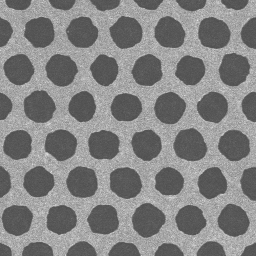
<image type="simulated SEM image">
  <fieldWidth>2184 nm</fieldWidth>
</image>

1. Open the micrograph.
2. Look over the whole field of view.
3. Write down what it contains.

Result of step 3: a regular array of holes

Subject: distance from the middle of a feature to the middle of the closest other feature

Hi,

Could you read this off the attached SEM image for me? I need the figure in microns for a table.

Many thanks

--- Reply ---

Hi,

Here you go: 0.364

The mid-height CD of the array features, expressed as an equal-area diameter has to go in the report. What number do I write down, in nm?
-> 262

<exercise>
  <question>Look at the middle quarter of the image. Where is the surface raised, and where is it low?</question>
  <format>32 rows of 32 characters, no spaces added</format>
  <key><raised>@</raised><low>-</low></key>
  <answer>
---@@@@-------@@@-------@@@@----
---@@@@-------@@@-------@@@@----
---@@@@------@@@@--------@@@----
---@@@@------@@@@-------@@@@----
--@@@@@@----@@@@@@-----@@@@@@@--
-@@@@@@@@@-@@@@@@@@@@-@@@@@@@@@@
@@@@@@@@@@@@@@@@@@@@@@@@@@@@@@@@
@@@----@@@@@@@--@@@@@@@@----@@@@
@@-----@@@@@@------@@@@------@@@
@-------@@@@-------@@@@-------@@
@-------@@@@-------@@@@-------@@
@-------@@@@--------@@@-------@@
@-------@@@@-------@@@@-------@@
@@@----@@@@@@-----@@@@@------@@@
@@@@-@@@@@@@@@@@@@@@@@@@----@@@@
@@@@@@@@@@@@@@@@@@@@@@@@@@@@@@@@
@@@@@@@@@@@@@@@@@@@@@-@@@@@@@@--
--@@@@@------@@@@@-----@@@@@----
---@@@--------@@@-------@@@@----
---@@@--------@@@-------@@@-----
---@@@--------@@@--------@@-----
---@@@--------@@@-------@@@@----
--@@@@@------@@@@@------@@@@----
--@@@@@-----@@@@@@@----@@@@@@---
@@@@@@@@@@@@@@@@@@@@@@@@@@@@@@@@
@@@@@@@@@@@@@@@@@@@@@@@@@@@@@@@@
@@-----@@@@@@-----@@@@@@----@@@@
@-------@@@--------@@@@------@@@
@-------@@@--------@@@@-------@@
@--------@@--------@@@@-------@@
@-------@@@---------@@@-------@@
@-------@@@@-------@@@@------@@@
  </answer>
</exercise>